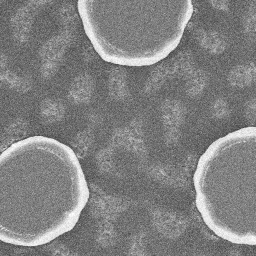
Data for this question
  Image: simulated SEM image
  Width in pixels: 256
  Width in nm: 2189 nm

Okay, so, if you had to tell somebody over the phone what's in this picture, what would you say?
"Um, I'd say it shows raised bodies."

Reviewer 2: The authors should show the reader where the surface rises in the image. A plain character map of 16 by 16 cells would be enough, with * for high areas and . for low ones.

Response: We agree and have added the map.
.....*******....
.....*******....
......*****.....
......****......
................
................
................
................
..............**
****.........***
*****.......****
*****.......****
*****.......****
*****........***
****..........**
................